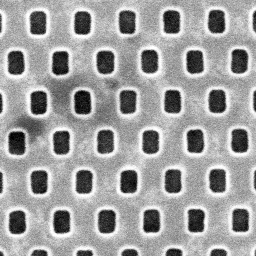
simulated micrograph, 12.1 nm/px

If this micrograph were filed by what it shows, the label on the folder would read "a regular array of holes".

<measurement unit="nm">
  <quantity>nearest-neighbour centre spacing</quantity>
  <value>535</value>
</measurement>